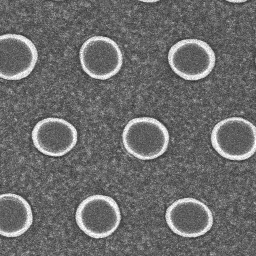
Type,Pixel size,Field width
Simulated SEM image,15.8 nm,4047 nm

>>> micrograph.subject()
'raised bodies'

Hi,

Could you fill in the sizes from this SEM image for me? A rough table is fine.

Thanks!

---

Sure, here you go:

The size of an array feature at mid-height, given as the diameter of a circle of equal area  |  629 nm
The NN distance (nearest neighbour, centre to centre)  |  1430 nm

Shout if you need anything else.